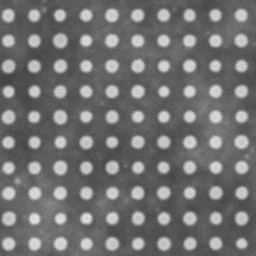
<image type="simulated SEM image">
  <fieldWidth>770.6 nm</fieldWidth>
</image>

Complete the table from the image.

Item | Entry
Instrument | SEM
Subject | a regular array of raised bodies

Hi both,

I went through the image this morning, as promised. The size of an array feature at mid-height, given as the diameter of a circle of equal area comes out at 34.4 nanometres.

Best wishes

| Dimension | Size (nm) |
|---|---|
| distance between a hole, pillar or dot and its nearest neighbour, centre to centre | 76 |